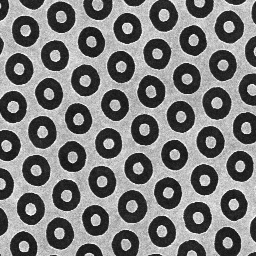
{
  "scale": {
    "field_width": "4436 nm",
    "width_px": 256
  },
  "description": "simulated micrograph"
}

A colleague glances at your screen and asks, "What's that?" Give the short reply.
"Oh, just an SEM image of a regular array of ring-shaped grooves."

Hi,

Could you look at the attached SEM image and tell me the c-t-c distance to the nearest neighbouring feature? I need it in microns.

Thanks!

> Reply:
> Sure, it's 0.661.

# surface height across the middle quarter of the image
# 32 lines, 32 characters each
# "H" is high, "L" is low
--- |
LHHHLLLHHHHLLHHHLLHHHLLLLLHHHLLL
HHHLLLLLHHHLLHHLLLHHHHHHHHHHLLLL
HHLLLLLLLHHLLLLLLHHHHHHHHHHLLLLL
HHLLHHLLLHHHLLLLLHHHLLLHHHHLLHHH
HHLLHHHLLHHHHLLLHHHLLLLLHHHLLLHH
HHLLLHLLLHHHHHHHHHHLLHLLLHHHLLLL
HHHLLLLLHHHHLLHHHHLLHHHLLHHHLLLL
HHHLLLLHHHLLLLLHHHLLLHHLLHHHHHLH
HHHHHHHHHHLLLLLLHHHLLLLLLHHHHHHH
HHHHHHHHHLLLHHLLHHHLLLLLLHHHLLHH
HLLLLHHHHLLLHHLLHHHHLLLHHHHLLLLL
HLLLLLHHHHLLHLLLHHHHHHHHHHLLLLLL
LLLHLLLHHHLLLLLLHHHHHHHHHHLLHHLL
LLHHHLLHHHHLLLLHHHLLLLLHHHLLHHLL
LLHHHLLHHHHHHHHHHLLLLLLHHHLLLHLL
HLLLLLLHHHHHHHHHHLLHHLLHHHHLLLLL
HLLLLLHHHLLLLHHHHLLHHLLLHHHLLLLH
HHHLLHHHLLLLLLHHHLLHHLLLHHHHHHHH
HHHHHHHHLLLLLLHHHLLLLLLHHHHHHHHH
HLLHHHHHLLHHLLLHHHLLLLHHHHLLLHHH
LLLLHHHHLLHHLLLHHHHHHHHHHLLLLLHH
LLLLLHHHLLLLLLHHHHHHHHHHLLLHLLLH
LHHLLLHHHLLLLLHHHLLLHHHHLLLHHLLH
LHHLLLHHHHLLHHHHLLLLLHHHLLLHHLLH
LLHLLHHHHHHHHHHLLLLLLLHHHLLLLLLH
LLLLLHHHHHHHHHHLLHHHLLHHHLLLLLHH
LLLLHHHLLLLLHHHLLHHHLLHHHHHLLHHH
HHHHHHLLLLLLLHHLLLHLLLHHHHHHHHHH
HHHHHHLLLHHLLHHHLLLLLLHHHLLHHHHH
LLLHHHLLHHHLLHHHHLLLLHHLLLLLLHHH
LLLHHHLLLHLLLHHHHHHHHHHLLLLLLHHH
LLLLHHHLLLLLLHHHHHHHHHHLLHHLLHHH